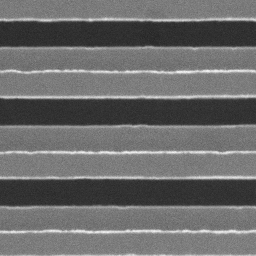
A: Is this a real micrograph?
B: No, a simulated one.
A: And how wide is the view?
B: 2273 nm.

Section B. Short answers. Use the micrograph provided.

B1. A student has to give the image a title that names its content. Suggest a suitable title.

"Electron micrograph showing lines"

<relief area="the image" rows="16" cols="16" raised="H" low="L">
HHHHHHHHHHHHHHHH
LLLLLLLLLLLLLLLL
LLLLLLLLLLLLLLLL
HHHHHHHHHHHHHHHH
HHHHHHHHHHHHHHHH
HHHHHHHHHHHHHHHH
LLLLLLLLLLLLLLLL
LLLLLLLLLLLLLLLL
HHHHHHHHHHHHHHHH
HHHHHHHHHHHHHHHH
HHHHHHHHHHHHHHHH
LLLLLLLLLLLLLLLL
LLLLLLLLLLLLLLLL
HHHHHHHHHHHHHHHH
HHHHHHHHHHHHHHHH
HHHHHHHHHHHHHHHH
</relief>